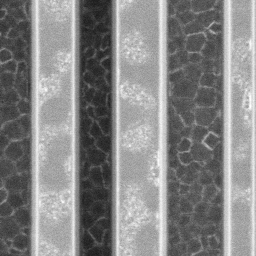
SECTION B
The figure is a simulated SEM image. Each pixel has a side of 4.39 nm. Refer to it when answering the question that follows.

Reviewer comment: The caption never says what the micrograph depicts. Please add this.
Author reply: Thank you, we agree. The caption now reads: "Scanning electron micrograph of one or a few lines or trenches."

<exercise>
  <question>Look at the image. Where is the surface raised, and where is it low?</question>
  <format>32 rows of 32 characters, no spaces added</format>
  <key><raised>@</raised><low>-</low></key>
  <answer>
----@@@@@-----@@@@@@--------@@@@
----@@@@@-----@@@@@@--------@@@@
----@@@@@-----@@@@@@--------@@@@
----@@@@@-----@@@@@@--------@@@@
----@@@@@-----@@@@@@--------@@@@
----@@@@@-----@@@@@@--------@@@@
----@@@@@-----@@@@@@--------@@@@
----@@@@@-----@@@@@@--------@@@@
----@@@@@-----@@@@@@--------@@@@
----@@@@@-----@@@@@@--------@@@@
----@@@@@-----@@@@@@--------@@@@
----@@@@@-----@@@@@@--------@@@@
----@@@@@-----@@@@@@--------@@@@
----@@@@@-----@@@@@@--------@@@@
----@@@@@-----@@@@@@--------@@@@
----@@@@@-----@@@@@@--------@@@@
----@@@@@-----@@@@@@--------@@@@
----@@@@@-----@@@@@@--------@@@@
----@@@@@-----@@@@@@--------@@@@
----@@@@@-----@@@@@@--------@@@@
----@@@@@-----@@@@@@--------@@@@
----@@@@@-----@@@@@@--------@@@@
----@@@@@-----@@@@@@--------@@@@
----@@@@@-----@@@@@@--------@@@@
----@@@@@-----@@@@@@--------@@@@
----@@@@@-----@@@@@@--------@@@@
----@@@@@-----@@@@@@--------@@@@
----@@@@@-----@@@@@@--------@@@@
----@@@@@-----@@@@@@--------@@@@
----@@@@@-----@@@@@@--------@@@@
----@@@@@-----@@@@@@--------@@@@
----@@@@@-----@@@@@@--------@@@@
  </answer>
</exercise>